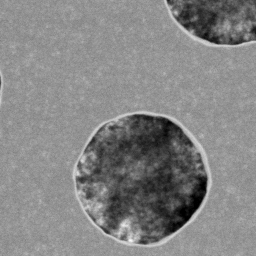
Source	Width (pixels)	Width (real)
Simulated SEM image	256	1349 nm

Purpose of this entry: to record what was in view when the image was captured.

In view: holes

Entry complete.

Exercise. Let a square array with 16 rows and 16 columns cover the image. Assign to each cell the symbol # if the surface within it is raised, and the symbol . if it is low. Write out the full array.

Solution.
###########.....
###########.....
#############...
################
################
################
################
#######....#####
######......####
#####.......####
#####........###
#####........###
#####........###
######......####
#######....#####
################